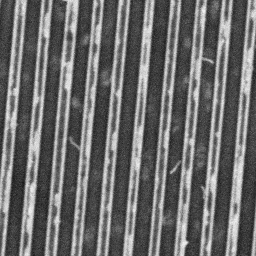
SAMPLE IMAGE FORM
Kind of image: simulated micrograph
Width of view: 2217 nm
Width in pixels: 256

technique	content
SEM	parallel lines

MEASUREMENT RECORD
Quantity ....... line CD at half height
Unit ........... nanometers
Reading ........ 68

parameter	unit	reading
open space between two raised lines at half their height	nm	161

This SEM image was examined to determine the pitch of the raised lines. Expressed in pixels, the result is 25.7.